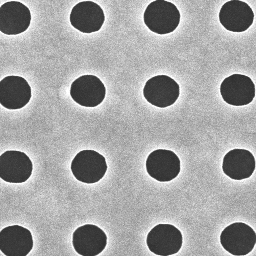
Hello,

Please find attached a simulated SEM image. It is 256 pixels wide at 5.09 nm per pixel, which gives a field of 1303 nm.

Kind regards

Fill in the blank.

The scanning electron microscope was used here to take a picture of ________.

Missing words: holes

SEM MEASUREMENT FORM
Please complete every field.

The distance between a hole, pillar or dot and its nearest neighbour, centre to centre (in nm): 377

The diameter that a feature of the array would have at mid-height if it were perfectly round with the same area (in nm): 173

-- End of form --